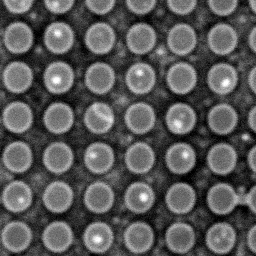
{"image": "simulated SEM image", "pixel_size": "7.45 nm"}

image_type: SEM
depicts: a regular array of raised bodies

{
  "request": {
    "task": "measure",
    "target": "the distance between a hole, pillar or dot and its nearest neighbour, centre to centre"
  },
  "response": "0.294 um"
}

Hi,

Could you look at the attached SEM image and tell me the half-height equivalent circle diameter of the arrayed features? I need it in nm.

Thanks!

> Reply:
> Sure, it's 214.